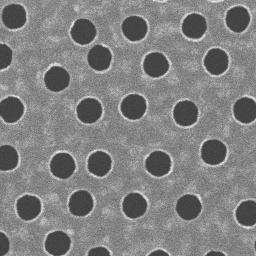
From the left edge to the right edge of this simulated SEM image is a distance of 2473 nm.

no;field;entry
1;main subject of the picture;a regular array of holes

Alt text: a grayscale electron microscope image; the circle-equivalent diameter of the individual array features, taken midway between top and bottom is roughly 246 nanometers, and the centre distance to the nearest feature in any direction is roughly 428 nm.